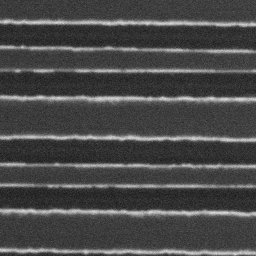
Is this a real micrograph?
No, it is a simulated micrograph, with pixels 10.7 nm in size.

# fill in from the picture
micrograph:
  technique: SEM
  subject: lines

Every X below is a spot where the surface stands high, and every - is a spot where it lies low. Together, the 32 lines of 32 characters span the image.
XXXXXXXXXXXXXXXXXXXXXXXXXXXXXXXX
XXXXXXXXXXXXXXXXXXXXXXXXXXXXXXXX
XXXXXXXXXXXXXXXXXXXXXXXXXXXXXXXX
--------------------------------
--------------------------------
--------------------------------
XXXXXXXXXXXXXXXXXXXXXXXXXXXXXXXX
XXXXXXXXXXXXXXXXXXXXXXXXXXXXXXXX
XXXXXXXXXXXXXXXXXXXXXXXXXXXXXXXX
--------------------------------
--------------------------------
--------------------------------
XXXXXXXXXXXXXXXXXXXXXXXXXXXXXXXX
XXXXXXXXXXXXXXXXXXXXXXXXXXXXXXXX
XXXXXXXXXXXXXXXXXXXXXXXXXXXXXXXX
XXXXXXXXXXXXXXXXXXXXXXXXXXXXXXXX
XXXXXXXXXXXXXXXXXXXXXXXXXXXXXXXX
----------------------------XXXX
--------------------------------
--------------------------------
--------------------------------
XXXXXXXXXXXXXXXXXXXXXXXXXXXXXXXX
XXXXXXXXXXXXXXXXXXXXXXXXXXXXXXXX
--------------------------------
--------------------------------
--------------------------------
XXXXXXXXXXXXXXXXXXXXX---XXXXX---
XXXXXXXXXXXXXXXXXXXXXXXXXXXXXXXX
XXXXXXXXXXXXXXXXXXXXXXXXXXXXXXXX
XXXXXXXXXXXXXXXXXXXXXXXXXXXXXXXX
XXXXXXXXXXXXXXXXXXXXXXXXXXXXXXXX
------------------XXX-XXXXXXXXXX